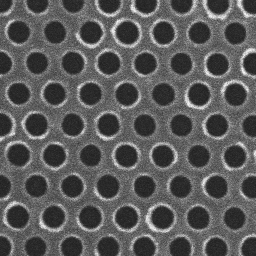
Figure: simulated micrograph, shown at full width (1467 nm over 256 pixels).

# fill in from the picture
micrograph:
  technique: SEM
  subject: a regular array of holes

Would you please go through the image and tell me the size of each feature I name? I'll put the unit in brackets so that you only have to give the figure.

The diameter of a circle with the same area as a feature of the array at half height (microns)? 0.127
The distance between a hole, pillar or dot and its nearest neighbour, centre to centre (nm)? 203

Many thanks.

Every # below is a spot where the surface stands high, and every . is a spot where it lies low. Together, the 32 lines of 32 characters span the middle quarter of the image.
.....####.....####.....####.....
.....####....#####.....####.....
#..########.########.#######...#
################################
################################
#####....#####....#####....#####
####.....####.....####......###.
####.....####......###......###.
####.....####.....####......###.
#####...######....#####....#####
################################
################################
##.#############################
....#####....#####....#####....#
.....###......####.....####.....
.....###......###......###......
.....####.....####.....####.....
#...######...#####....#####....#
################################
################################
#####...######..########.#######
####.....####.....#####....####.
####.....####.....####.....####.
.###.....####.....####.....####.
####.....####.....####.....####.
######..#######..######...######
################################
################################
....#####....#####....#####....#
....####......####.....####.....
.....###......####.....###......
.....###......####.....####.....